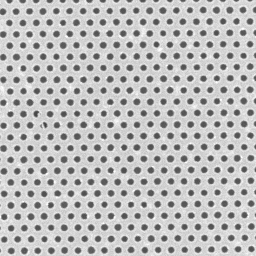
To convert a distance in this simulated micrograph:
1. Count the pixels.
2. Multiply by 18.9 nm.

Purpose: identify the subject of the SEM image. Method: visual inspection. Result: a regular array of holes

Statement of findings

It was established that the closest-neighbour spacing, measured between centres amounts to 244 nanometers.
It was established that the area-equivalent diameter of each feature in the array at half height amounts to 6.77 pixels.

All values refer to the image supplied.